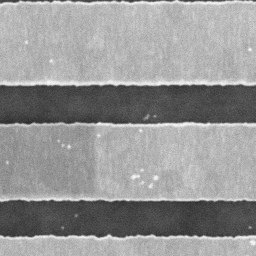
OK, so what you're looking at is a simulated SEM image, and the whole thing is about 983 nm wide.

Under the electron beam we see lines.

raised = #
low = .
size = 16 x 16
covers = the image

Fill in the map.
################
################
################
################
################
................
................
................
################
################
################
################
################
................
................
################